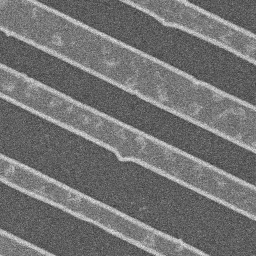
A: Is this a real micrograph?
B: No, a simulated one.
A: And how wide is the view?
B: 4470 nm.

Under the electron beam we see one or a few lines or trenches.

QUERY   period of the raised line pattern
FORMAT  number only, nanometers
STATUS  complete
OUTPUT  1250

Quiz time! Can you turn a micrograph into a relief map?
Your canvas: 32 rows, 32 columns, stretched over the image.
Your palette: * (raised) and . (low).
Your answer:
*****...........********........
*******............*******......
*********...........*******.....
***********............*******..
..***********............*******
....***********............*****
......***********............***
........***********............*
*..........**********...........
***..........**********.........
*****..........**********.......
*******..........***********....
.********..........***********..
...********..........***********
.....********..........*********
........*******..........*******
..........*******..........*****
............*******..........***
..............********.........*
...............*********........
**................*******.......
****................********....
******................********..
..******................********
.....*****................******
.......******...............****
.........******...............**
...........*****................
.............*****..............
*..............******...........
***..............******.........
*****..............******.......